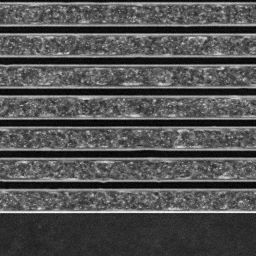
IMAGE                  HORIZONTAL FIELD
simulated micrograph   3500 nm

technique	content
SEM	parallel lines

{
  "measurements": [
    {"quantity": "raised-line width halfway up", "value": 22.9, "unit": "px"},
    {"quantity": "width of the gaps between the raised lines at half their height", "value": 116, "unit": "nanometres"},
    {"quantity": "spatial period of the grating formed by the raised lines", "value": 426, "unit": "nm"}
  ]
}